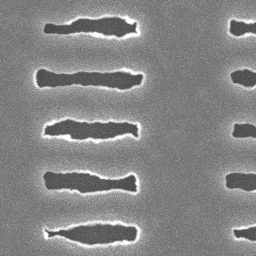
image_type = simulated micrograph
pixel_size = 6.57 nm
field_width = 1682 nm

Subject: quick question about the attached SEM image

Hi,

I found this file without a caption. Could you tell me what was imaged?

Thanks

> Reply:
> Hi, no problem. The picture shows holes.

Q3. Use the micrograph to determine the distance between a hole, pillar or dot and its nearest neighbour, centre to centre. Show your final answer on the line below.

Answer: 345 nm